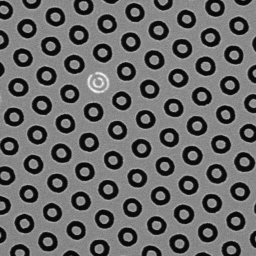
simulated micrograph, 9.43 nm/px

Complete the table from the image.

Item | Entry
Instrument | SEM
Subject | a regular array of ring-shaped grooves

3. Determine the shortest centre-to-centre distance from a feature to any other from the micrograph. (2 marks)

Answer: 0.278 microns